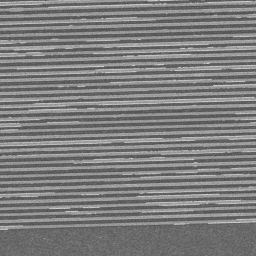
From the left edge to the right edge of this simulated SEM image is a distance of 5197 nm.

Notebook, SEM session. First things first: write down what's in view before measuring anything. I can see parallel lines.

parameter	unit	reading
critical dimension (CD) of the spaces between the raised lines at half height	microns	0.0761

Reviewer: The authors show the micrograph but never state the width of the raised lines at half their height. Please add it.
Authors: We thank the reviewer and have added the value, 50.7 nanometers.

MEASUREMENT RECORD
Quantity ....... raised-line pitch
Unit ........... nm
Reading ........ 130